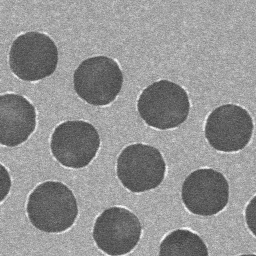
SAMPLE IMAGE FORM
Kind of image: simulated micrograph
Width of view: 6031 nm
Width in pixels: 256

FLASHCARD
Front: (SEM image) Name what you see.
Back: a regular array of holes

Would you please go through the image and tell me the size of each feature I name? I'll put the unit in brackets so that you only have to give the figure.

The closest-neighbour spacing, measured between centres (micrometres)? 1.59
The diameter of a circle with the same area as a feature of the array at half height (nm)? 1190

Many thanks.